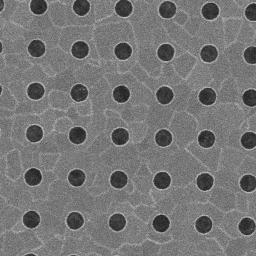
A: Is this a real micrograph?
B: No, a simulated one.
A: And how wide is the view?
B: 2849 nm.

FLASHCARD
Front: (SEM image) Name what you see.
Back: a regular array of holes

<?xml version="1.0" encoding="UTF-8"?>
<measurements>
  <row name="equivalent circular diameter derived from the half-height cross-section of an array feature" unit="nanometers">202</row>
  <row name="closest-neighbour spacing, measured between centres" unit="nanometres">473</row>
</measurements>